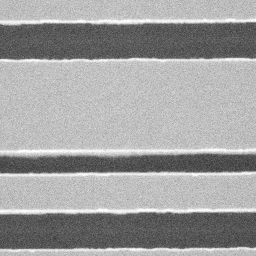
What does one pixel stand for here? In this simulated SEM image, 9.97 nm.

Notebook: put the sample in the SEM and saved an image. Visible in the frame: lines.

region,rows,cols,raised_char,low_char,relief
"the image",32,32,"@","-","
@@@@@@@@@@@@@@@@@@@@@@@@@@@@@@@@
@@@@@@@@@@@@@@@@@@@@@@@@@@@@@@@@
@@@@@@@@@@@@@@@@@@@@@@@@@@@@@@@@
--------------------------------
--------------------------------
--------------------------------
--------------------------------
@--@@----@@-@@@@@@@@@@@@@@@@@@@@
@@@@@@@@@@@@@@@@@@@@@@@@@@@@@@@@
@@@@@@@@@@@@@@@@@@@@@@@@@@@@@@@@
@@@@@@@@@@@@@@@@@@@@@@@@@@@@@@@@
@@@@@@@@@@@@@@@@@@@@@@@@@@@@@@@@
@@@@@@@@@@@@@@@@@@@@@@@@@@@@@@@@
@@@@@@@@@@@@@@@@@@@@@@@@@@@@@@@@
@@@@@@@@@@@@@@@@@@@@@@@@@@@@@@@@
@@@@@@@@@@@@@@@@@@@@@@@@@@@@@@@@
@@@@@@@@@@@@@@@@@@@@@@@@@@@@@@@@
@@@@@@@@@@@@@@@@@@@@@@@@@@@@@@@@
@@@@@@@@@@@@@@@@@@@@@@@@@@@@@@@@
--------------------------------
--------------------------------
--------------------------------
@@@@@@@@@@@@@@@@@@@@@@@@@@@@@@@@
@@@@@@@@@@@@@@@@@@@@@@@@@@@@@@@@
@@@@@@@@@@@@@@@@@@@@@@@@@@@@@@@@
@@@@@@@@@@@@@@@@@@@@@@@@@@@@@@@@
--------------------------------
--------------------------------
--------------------------------
--------------------------------
--------------------------------
@@@@@@@@@@@@@@@@@@@@@@@@@@@@@@@@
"